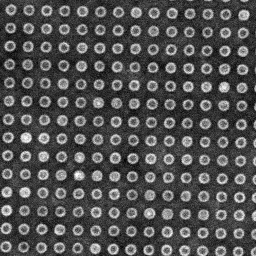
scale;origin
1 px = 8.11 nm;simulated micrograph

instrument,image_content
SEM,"a regular array of raised bodies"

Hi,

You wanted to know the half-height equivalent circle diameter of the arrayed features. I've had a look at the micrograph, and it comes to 0.0809 µm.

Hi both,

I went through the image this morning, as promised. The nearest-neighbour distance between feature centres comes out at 143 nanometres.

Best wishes